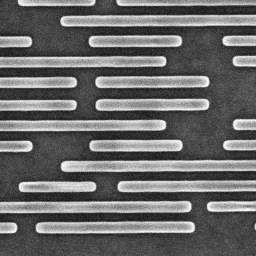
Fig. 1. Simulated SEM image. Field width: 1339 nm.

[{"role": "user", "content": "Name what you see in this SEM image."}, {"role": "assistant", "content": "wiring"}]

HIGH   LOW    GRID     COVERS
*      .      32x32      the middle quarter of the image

**********.*********............
................................
................................
**......************************
***.....************************
***.....************************
................................
................................
................................
***.....************************
***.....************************
...........**...................
................................
................................
*************************.......
*************************.......
************************........
................................
................................
.......**********************...
.......**********************...
.......**********************...
................................
................................
********************************
********************************
********************************
................................
................................
**..***.......******************
********.....*******************
********......******************